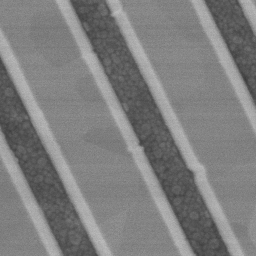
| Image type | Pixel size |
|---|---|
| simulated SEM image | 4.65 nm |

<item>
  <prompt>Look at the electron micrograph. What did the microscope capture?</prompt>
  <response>one or a few lines or trenches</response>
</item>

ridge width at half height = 0.338 um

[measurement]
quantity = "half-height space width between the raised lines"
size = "47.1 px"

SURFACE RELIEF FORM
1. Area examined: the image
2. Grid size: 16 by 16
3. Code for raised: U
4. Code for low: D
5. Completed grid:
UUUUDDDUUUUUDDDD
UUUUUDDDUUUUUDDD
UUUUUDDDUUUUUDDD
DUUUUUDDDUUUUUDD
DUUUUUDDDUUUUUDD
DUUUUUUDDDUUUUUD
DDUUUUUDDDUUUUUD
DDUUUUUUDDDUUUUU
DDDUUUUUDDDUUUUU
DDDUUUUUDDDDUUUU
UDDDUUUUUDDDUUUU
UDDDUUUUUDDDDUUU
UUDDDUUUUUDDDUUU
UUDDDUUUUUDDDDUU
UUUDDDUUUUUDDDUU
UUUDDDUUUUUDDDDU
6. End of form